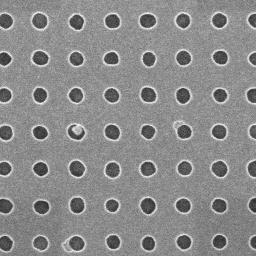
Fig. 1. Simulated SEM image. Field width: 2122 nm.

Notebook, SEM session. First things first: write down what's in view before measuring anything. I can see a regular array of holes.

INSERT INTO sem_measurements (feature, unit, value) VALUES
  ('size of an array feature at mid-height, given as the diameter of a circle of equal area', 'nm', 127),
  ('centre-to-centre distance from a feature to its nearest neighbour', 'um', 0.293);